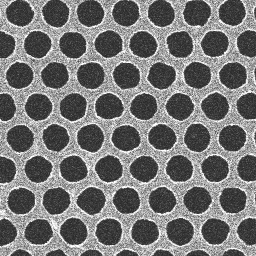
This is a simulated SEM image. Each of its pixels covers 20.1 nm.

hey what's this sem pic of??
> a regular array of holes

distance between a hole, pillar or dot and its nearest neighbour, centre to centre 704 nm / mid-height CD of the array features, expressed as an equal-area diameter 550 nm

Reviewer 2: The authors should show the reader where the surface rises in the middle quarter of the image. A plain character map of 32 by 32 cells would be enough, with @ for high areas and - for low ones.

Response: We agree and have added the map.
@@@@-----@@@@-----@@@@-----@@@@-
-@@-------@@-------@@-------@@--
-@@-------@@-------@@-------@@--
-@@-------@@-------@@-------@@--
-@@@------@@@------@@-------@@--
@@@@@----@@@@@----@@@@-----@@@@-
@@@@@@@@@@@@@@@@@@@@@@@@@@@@@@@@
@---@@@@@@--@@@@@@@--@@@@@@---@@
-----@@@------@@@@-----@@@------
------@@------@@@------@@@------
------@@-------@@------@@-------
-----@@@-------@-------@@@------
-----@@@------@@@------@@@------
----@@@@@----@@@@@----@@@@@----@
@@@@@@@@@@@@@@@@@@@@@@@@@@@@@@@@
@@@@@----@@@@@---@@@@@@---@@@@@-
-@@@-----@@@@-----@@@@-----@@@@-
-@@-------@@-------@@-------@@--
-@@-------@@-------@@-------@@--
-@@-------@@-------@@-------@@--
-@@@------@@@------@@@-----@@@@-
@@@@@----@@@@@---@@@@@@@-@@@@@@-
@@@@@@@@@@@@@@@@@@@@@@@@@@@@@@@@
----@@@@@----@@@@@----@@@@@----@
-----@@@------@@@------@@@------
------@@-------@--------@@------
------@@-------@--------@-------
------@@-------@@------@@@------
-----@@@@-----@@@@-----@@@@-----
@--@@@@@@@--@@@@@@@--@@@@@@@--@@
@@@@@@@@@@@@@@@@@@@@@@@@@@@@@@@@
@@@@@----@@@@-----@@@@-----@@@@-